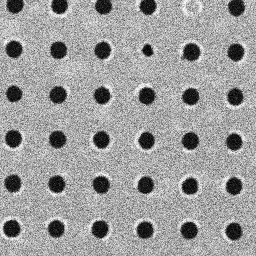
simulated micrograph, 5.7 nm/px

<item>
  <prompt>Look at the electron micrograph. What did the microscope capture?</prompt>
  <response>a regular array of holes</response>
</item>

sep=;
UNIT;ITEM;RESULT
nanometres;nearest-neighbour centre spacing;251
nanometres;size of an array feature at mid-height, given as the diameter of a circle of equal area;97.5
